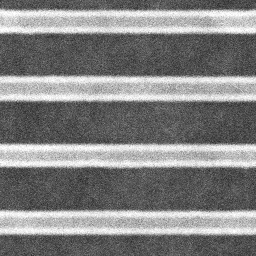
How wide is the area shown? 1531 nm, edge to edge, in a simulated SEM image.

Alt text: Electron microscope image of one or a few lines or trenches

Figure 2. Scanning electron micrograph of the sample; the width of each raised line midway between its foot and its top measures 102 nanometers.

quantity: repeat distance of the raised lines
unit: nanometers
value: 400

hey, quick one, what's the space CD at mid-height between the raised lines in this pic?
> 0.296 micrometres